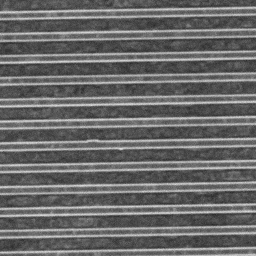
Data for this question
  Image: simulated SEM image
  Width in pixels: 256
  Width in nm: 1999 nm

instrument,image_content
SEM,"parallel lines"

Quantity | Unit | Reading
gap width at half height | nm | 110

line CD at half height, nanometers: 61.5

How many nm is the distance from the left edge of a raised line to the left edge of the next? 171